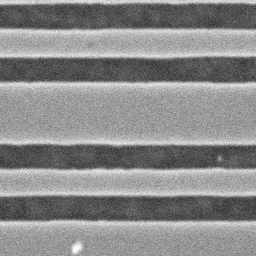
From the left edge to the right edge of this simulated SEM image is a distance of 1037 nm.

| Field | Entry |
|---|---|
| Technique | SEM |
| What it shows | lines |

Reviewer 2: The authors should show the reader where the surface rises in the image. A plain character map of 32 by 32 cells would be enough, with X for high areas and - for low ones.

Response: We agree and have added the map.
--------------------------------
--------------------------------
--------------------------------
--------------------------------
XXXXXXXXXXXXXXXXXXXXXXXXXXXXXXXX
XXXXXXXXXXXXXXXXXXXXXXXXXXXXXXXX
XXXXXXXXXXXXXXXXXXXXXXXXXXXXXXXX
--------------------------------
--------------------------------
--------------------------------
XXXXXXXXXXXXXXXXXXXXXXXXXXX-XXXX
XXXXXXXXXXXXXXXXXXXXXXXXXXXXXXXX
XXXXXXXXXXXXXXXXXXXXXXXXXXXXXXXX
XXXXXXXXXXXXXXXXXXXXXXXXXXXXXXXX
XXXXXXXXXXXXXXXXXXXXXXXXXXXXXXXX
XXXXXXXXXXXXXXXXXXXXXXXXXXXXXXXX
XXXXXXXXXXXXXXXXXXXXXXXXXXXXXXXX
XXXXXXXXXXXXXXXXXXXXXXXXXXXXXXXX
--------------------------------
--------------------------------
--------------------------------
XXXXXXXXXXXXXXXXXXXXXXXXXXXXXXXX
XXXXXXXXXXXXXXXXXXXXXXXXXXXXXXXX
XXXXXXXXXXXXXXXXXXXXXXXXXXXXXXXX
--------------------------------
--------------------------------
--------------------------------
--------------------------------
XXXXXXXXXXXXXXXXXXXXXXXXXXXXXXXX
XXXXXXXXXXXXXXXXXXXXXXXXXXXXXXXX
XXXXXXXXXXXXXXXXXXXXXXXXXXXXXXXX
XXXXXXXXXXXXXXXXXXXXXXXXXXXXXXXX